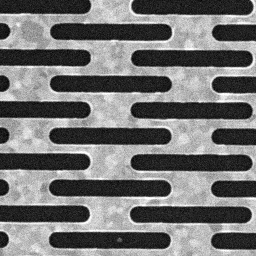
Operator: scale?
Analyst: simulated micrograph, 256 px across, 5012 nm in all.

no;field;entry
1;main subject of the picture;groups of lines, slits or small figures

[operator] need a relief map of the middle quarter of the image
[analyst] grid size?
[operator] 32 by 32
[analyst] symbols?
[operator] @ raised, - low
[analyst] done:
------@@@@@@@@@@@@--------------
@@@@@@@@@@@@@@@@@@@@@@@@@@@@@@@@
---@@@@@@@@--@@@@@@@@@@@@@@@@@@@
--------------------------@@@@@@
---------------------------@@@@@
---------------------------@@@@@
---------------------------@@@@@
@@@@@@@--@@@@@@@@@@@@@@@@@@@@@@@
@@@@@@@@@@@@@@@@@@@@@@@@@@@@@@@@
------@@@@@@@@@@@@--------------
-------@@@@@@@@@@---------------
-------@@@@@@@@@@---------------
-------@@@@@@@@@@---------------
------@@@@@@@@@@@@--------------
@@@@@@@@@@@@@@@@@@@@@@@@@@@@@@@@
@@@@@@@@@@@@@@@@@@@@@@@@@@@@@@@@
--------------------------@@@@@@
---------------------------@@@@@
---------------------------@@@@@
---------------------------@@@@@
@@@@@@@@@@@@@@@@@@@@@@@@@@@@@@@@
@@@@@@@@@@@@@@@@@@@@@@@@@@@@@@@@
------@@@@@@@@@@@@--------------
-------@@@@@@@@@@---------------
-------@@@@@@@@@@---------------
-------@@@@@@@@@@---------------
-----@@@@@@@@@@@@---------------
@@@@@@@@@@@@@@@@@@@@@@@@@@@@@@@@
@@@@@@@@@@@@@@@@@@@@@@@@@@@@@@@@
--------------------------@@@@@@
---------------------------@@@@@
---------------------------@@@@@